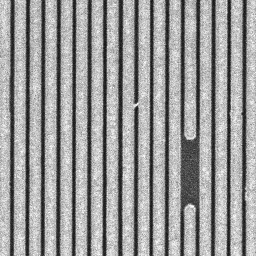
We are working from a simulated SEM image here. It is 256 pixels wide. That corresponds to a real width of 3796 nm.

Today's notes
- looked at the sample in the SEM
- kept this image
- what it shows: parallel lines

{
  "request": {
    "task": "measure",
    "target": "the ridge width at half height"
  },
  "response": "161 nanometers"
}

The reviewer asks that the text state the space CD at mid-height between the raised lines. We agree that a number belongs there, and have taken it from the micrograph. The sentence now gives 59.3 nm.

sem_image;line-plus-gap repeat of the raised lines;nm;229